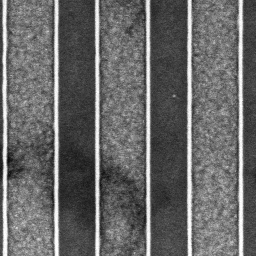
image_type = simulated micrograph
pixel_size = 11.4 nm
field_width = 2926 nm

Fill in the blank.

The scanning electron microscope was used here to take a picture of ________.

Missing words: one or a few lines or trenches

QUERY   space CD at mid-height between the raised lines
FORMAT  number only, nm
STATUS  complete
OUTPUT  588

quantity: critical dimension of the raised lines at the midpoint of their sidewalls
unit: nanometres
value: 470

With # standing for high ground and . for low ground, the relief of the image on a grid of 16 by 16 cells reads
....##...###...#
....##...###...#
....##...###...#
....##...###...#
....##...###...#
....##...###...#
....##...###...#
....##...###...#
....##...###...#
....##...###...#
....##...###...#
....##...###...#
....##...###...#
....##...###...#
....##...###...#
....##...###...#